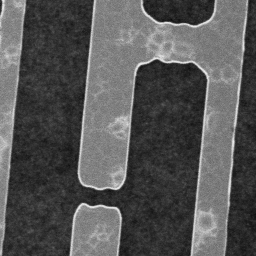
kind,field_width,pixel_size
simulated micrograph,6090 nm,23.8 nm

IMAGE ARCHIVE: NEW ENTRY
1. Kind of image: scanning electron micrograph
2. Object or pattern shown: one or a few lines or trenches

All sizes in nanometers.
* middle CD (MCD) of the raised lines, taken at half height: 802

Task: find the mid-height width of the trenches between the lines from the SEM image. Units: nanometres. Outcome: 1650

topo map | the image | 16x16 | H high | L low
HHLLLLHHHLLLLHHL
HLLLLLHHHHHLLHHL
HLLLLLHHHHHHHHHL
HLLLLLHHHHHHHHHL
HLLLLHHHHLLLLHHL
HLLLLHHHLLLLLHHL
HLLLLHHHLLLLLHHL
HLLLLHHHLLLLLHHL
HLLLLHHHLLLLLHHL
HLLLLHHHLLLLLHHL
HLLLLHHHLLLLHHLL
LLLLLHHHLLLLHHLL
LLLLLLLLLLLLHHLL
LLLLLHHHLLLLHHLL
LLLLLHHHLLLLHHLL
LLLLHHHLLLLLHHLL